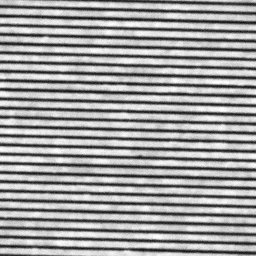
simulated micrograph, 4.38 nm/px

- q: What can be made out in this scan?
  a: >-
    parallel lines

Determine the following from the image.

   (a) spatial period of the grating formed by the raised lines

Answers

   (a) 40.3 nm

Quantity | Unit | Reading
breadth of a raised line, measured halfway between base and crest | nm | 23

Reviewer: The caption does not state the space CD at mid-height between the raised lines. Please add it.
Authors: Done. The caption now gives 19.2 nm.